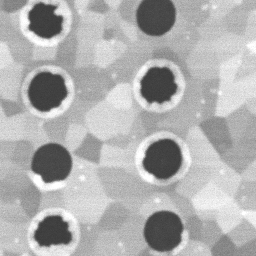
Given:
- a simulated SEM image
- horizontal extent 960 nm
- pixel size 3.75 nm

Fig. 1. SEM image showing holes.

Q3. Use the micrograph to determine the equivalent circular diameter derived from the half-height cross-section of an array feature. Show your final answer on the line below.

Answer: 147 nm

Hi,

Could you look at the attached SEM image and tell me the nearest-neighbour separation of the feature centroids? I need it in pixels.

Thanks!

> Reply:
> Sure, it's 70.7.